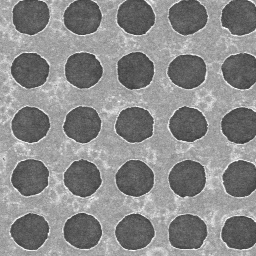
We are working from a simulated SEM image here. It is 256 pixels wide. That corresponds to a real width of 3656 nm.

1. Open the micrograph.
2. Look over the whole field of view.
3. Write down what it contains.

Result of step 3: a regular array of holes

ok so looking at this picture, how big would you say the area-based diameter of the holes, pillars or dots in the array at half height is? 538 nanometres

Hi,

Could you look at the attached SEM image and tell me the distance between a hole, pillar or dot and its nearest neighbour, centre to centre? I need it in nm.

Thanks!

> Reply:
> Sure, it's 746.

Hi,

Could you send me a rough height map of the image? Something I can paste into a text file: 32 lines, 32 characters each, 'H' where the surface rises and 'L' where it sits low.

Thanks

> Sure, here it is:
HHLLLLHHHLLLHHHLLLLHHHLLLHHHLLLL
HHLLLLHHLLLLLHHLLLLHHLLLLLHHLLLL
HHLLLLHHLLLLLHHLLLLHHLLLLLHHLLLL
HHLLLLHHLLLLHHHLLLLHHHLLLHHHLLLL
HHHHHHHHHHHHHHHHHHHHHHHHHHHHHHHH
HHHHHHHHHHHHHHHHHHHHHHHHHHHHHHHH
HHHHHHHHHHHHHHHHHHHHHHHHHHHHHHHH
HHLLLLHHLLLLHHHLLLLHHHLLLHHHLLLL
HLLLLLHHLLLLLHHLLLLHHLLLLLHHLLLL
HHLLLLHHLLLLLHHLLLLHHLLLLLHHLLLL
HHLLLHHHHLLLHHHLLLLHHHLLLHHHHLLL
HHHHHHHHHHHHHHHHHHHHHHHHHHHHHHHH
HHHHHHHHHHHHHHHHHHHHHHHHHHHHHHHH
HHHLLHHHHLLHHHHHLLHHHHLLHHHHHHLH
HHLLLLHHLLLLHHHLLLLHHLLLLHHHLLLL
HLLLLLHHLLLLLHLLLLLHHLLLLLHHLLLL
HHLLLLHHLLLLHHLLLLLHHLLLLLHHLLLL
HHLLLHHHHLLLHHHHLLHHHHLLLHHHHLLH
HHHHHHHHHHHHHHHHHHHHHHHHHHHHHHHH
HHHHHHHHHHHHHHHHHHHHHHHHHHHHHHHH
HHLLLHHHHLLLHHHHLLHHHHLLLHHHHLLL
HHLLLLHHLLLLHHHLLLLHHLLLLLHHLLLL
HLLLLLHHLLLLLHLLLLLHHLLLLLHHLLLL
HHLLLLHHLLLLHHHLLLLHHLLLLHHHLLLL
HHHLHHHHHHLLHHHHLLHHHHLLHHHHHLLH
HHHHHHHHHHHHHHHHHHHHHHHHHHHHHHHH
HHHHHHHHHHHHHHHHHHHHHHHHHHHHHHHH
HHLLLLHHLLLLHHHLLLLHHHLLLHHHLLLL
HLLLLLHHLLLLLHLLLLLHHLLLLLHHLLLL
HLLLLLHHLLLLLHLLLLLHHLLLLLHHLLLL
HHLLLHHHHLLLHHHLLLLHHLLLLHHHLLLL
HHHHHHHHHHHHHHHHHHHHHHHHHHHHHHHH